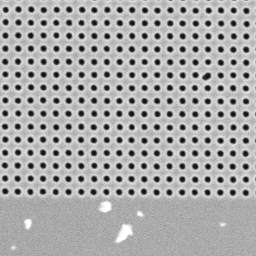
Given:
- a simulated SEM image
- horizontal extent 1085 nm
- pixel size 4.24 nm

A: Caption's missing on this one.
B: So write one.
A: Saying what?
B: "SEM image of a regular array of holes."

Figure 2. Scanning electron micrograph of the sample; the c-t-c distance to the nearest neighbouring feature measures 52.4 nm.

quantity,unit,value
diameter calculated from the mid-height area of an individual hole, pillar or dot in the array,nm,27.1